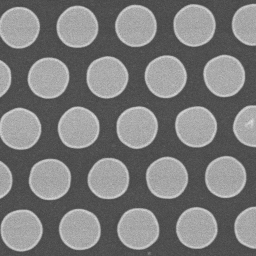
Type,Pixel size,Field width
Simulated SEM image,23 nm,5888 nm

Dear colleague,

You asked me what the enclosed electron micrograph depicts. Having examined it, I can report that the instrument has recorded an array of small figures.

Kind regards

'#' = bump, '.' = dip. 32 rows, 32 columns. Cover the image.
...............................#
.###....###....####...####....##
#####..#####..#####...#####..###
#####..#####..######..#####..###
#####..#####...####...#####..###
.###....###.....##.....##......#
................................
.....##.....###....###....####..
#...####...#####..#####...####..
#...#####..#####..#####..######.
#...####...#####..#####...####..
#...####....###....###....####..
................................
..#......#......##.....###.....#
####....####...####...#####...##
#####..#####...#####..#####..###
#####..#####...#####..#####..###
#####...####...####....####...##
.###.....#.......#..............
................................
#....###....###....####...####..
#...#####..#####..#####...#####.
#...#####..#####..#####...#####.
#...#####..#####...####...####..
#....###....###.....##.....##...
................................
..##.....##.....###....###....##
#####...####...#####..#####..###
#####..######..#####..#####..###
#####...#####..#####..#####..###
.####...####....###....###....##
................................